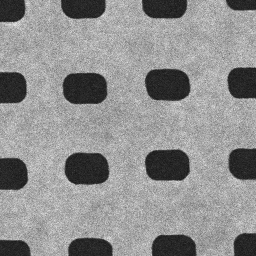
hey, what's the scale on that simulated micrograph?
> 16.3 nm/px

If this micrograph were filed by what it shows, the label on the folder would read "holes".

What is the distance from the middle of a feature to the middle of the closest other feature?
1.31 um